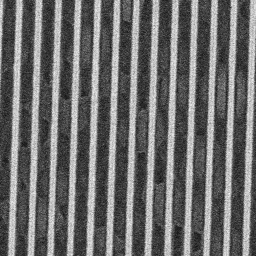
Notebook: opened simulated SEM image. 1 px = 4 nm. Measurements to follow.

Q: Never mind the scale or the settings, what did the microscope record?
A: parallel lines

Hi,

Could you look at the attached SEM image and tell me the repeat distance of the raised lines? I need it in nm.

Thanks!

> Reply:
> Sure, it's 78.1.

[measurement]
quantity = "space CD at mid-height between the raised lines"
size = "58 nm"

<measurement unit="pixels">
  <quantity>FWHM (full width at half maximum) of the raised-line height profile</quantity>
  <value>5.38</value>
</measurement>